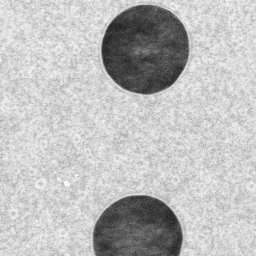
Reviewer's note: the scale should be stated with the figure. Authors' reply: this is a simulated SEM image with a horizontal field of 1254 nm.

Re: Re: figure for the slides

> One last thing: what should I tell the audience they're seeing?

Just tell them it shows holes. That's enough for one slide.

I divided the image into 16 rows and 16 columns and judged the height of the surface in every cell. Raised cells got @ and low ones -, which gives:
@@@@@@@@--@@@@@@
@@@@@@@----@@@@@
@@@@@@------@@@@
@@@@@@------@@@@
@@@@@@@----@@@@@
@@@@@@@@--@@@@@@
@@@@@@@@@@@@@@@@
@@@@@@@@@@@@@@@@
@@@@@@@@@@@@@@@@
@@@@@@@@@@@@@@@@
@@@@@@@@@@@@@@@@
@@@@@@@@@@@@@@@@
@@@@@@@---@@@@@@
@@@@@@-----@@@@@
@@@@@@-----@@@@@
@@@@@@-----@@@@@